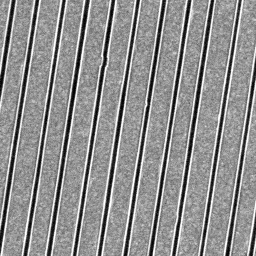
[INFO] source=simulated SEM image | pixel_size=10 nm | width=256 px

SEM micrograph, parallel lines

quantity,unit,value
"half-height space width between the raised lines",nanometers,194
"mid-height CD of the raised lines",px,5.93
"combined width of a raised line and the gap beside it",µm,0.251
